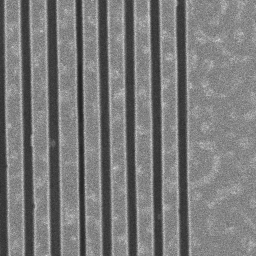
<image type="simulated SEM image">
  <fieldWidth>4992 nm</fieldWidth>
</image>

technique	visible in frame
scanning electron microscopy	parallel lines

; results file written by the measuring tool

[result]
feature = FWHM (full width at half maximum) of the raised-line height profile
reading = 0.339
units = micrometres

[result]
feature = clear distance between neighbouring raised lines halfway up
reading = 8.75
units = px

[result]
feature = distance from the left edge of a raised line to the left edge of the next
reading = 504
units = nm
